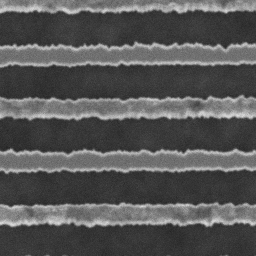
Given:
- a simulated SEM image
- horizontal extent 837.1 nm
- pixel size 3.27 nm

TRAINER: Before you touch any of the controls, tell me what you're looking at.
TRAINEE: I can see lines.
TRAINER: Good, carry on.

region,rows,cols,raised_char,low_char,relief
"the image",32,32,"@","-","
@@@@@@@@@@@@@@@@@@@@@@@@@@@@@@@@
--------@@----------------------
--------------------------------
--------------------------------
--------------------------------
-----------------@-@---@@-------
@@@@@@@@@@@@@@@@@@@@@@@@@@@@@@@@
@@@@@@@@@@@@@@@@@@@@@@@@@@@@@@@@
--------------------------------
--------------------------------
--------------------------------
--------------------------------
@@@@@@@-@-@@@@@-@@@@@@@@@@@@@@@@
@@@@@@@@@@@@@@@@@@@@@@@@@@@@@@@@
--@@@@@@@@@-@@@@@@@@-@@----@@--@
--------------------------------
--------------------------------
--------------------------------
--------------------------------
@@@@@@@@@@@@@@@@@@@@@@@@@@@@@@@@
@@@@@@@@@@@@@@@@@@@@@@@@@@@@@@@@
--------------------------------
--------------------------------
--------------------------------
--------------------------------
--------------------------------
@@@@@@@@@@@@@@@@@@@@@@@@@@@@@@@@
@@@@@@@@@@@@@@@@@@@@@@@@@@@@@@@@
--------------------------------
--------------------------------
--------------------------------
--------------------------------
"